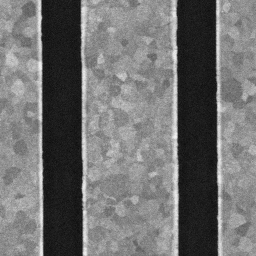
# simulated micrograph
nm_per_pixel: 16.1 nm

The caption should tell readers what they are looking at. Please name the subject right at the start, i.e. lines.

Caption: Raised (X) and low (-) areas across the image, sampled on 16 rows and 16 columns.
XXX--XXXXXX---XX
XXX--XXXXXX---XX
XXX--XXXXXX---XX
XXX--XXXXXX---XX
XXX--XXXXXX---XX
XXX--XXXXXX---XX
XXX--XXXXXX---XX
XXX--XXXXXX---XX
XXX--XXXXXX---XX
XXX--XXXXXX---XX
XXX--XXXXXX---XX
XXX--XXXXXX---XX
XXX--XXXXXX---XX
XXX--XXXXXX---XX
XXX--XXXXXX---XX
XXX--XXXXXX---XX